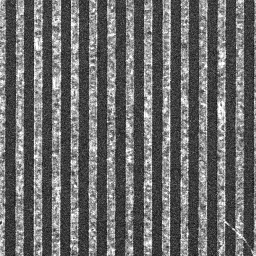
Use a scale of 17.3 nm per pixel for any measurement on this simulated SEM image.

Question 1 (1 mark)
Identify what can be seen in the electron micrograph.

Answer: parallel lines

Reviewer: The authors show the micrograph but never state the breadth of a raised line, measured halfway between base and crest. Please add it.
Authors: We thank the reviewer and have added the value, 123 nanometers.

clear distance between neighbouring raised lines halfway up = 197 nm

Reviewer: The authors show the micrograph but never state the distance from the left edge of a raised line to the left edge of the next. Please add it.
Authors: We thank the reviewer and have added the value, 0.316 um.